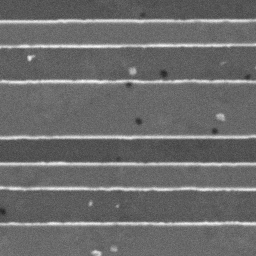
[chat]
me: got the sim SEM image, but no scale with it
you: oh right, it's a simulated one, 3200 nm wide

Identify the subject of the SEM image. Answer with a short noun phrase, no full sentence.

lines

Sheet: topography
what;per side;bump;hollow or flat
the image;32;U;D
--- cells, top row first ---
DDDDDDDDDDDDDDDDDDDDDDDDDDDDDDDD
DDDDDDDDDDDDDDDDDDDDDDDDDDDDDDDD
DDDDDDDDDDDDDDDDDDDDDDDDDDDDDDDD
UUUUUUUUUUUUUUUUUUUUUUUUUUUUUUUU
UUUUUUUUUUUUUUUUUUUUUUUUUUUUUUUU
UUUUUUUUUUUUUUUUUUUUUUUUUUUUUUUU
DDDDDDDDDDDDDDDDDDDDDDDDDDDDDDDD
DDDDDDDDDDDDDDDDDDDDDDDDDDDDDDDD
DDDDDDDDDDDDDDDDDDDDDDDDDDDDDDDD
DDDDDDDDDDDDDDDDDDDDDDDDDDDDDDDD
UUUUUUUUUUUUUUUUUUUUUUUUUUUUUUUU
UUUUUUUUUUUUUUUUUUUUUUUUUUUUUUUU
UUUUUUUUUUUUUUUUUUUUUUUUUUUUUUUU
UUUUUUUUUUUUUUUUUUUUUUUUUUUUUUUU
UUUUUUUUUUUUUUUUUUUUUUUUUUUUUUUU
UUUUUUUUUUUUUUUUUUUUUUUUUUUUUUUU
UUUUUUUUUUUUUUUUUUUUUUUUUUUUUUUU
DDDDDDDDDDDDDDDDDDDDDDDDDDDDDDDD
DDDDDDDDDDDDDDDDDDDDDDDDDDDDDDDD
DDDDDDDDDDDDDDDDDDDDDDDDDDDDDDDD
UDDUUUUUUUUUDDDUDDDUDUUDDDDDDDUD
UUUUUUUUUUUUUUUUUUUUUUUUUUUUUUUU
UUUUUUUUUUUUUUUUUUUUUUUUUUUUUUUU
UUUUUUUUUUUUUUUUUUUUUUUUUUUUUUUU
DDDDDDDDDDDDDDDDDDDDDDDDDDDDDDDD
DDDDDDDDDDDDDDDDDDDDDDDDDDDDDDDD
DDDDDDDDDDDDDDDDDDDDDDDDDDDDDDDD
DDDDDDDDDDDDDDDDDDDDDDDDDDDDDDDD
UUUUUUUUUUUUUUUUUUUUUUUUUUUUUUUU
UUUUUUUUUUUUUUUUUUUUUUUUUUUUUUUU
UUUUUUUUUUUUUUUUUUUUUUUUUUUUUUUU
UUUUUUUUUUUUUUUUUUUUUUUUUUUUUUUU